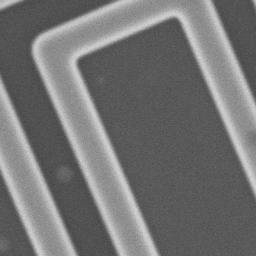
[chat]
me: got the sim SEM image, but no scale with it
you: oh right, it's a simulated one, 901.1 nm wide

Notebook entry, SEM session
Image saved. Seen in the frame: groups of lines, slits or small figures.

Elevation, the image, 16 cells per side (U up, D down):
DDDDDDUUUUUUUDDD
DDDDUUUUUUDUUUDD
DDUUUUUDDDDDUUDD
DDUUUDDDDDDDUUUD
DDDUUDDDDDDDDUUD
DDDUUDDDDDDDDUUD
UDDUUUDDDDDDDDUU
UDDDUUDDDDDDDDUU
UUDDUUUDDDDDDDUU
UUDDDUUDDDDDDDDU
UUDDDUUUDDDDDDDU
UUUDDDUUDDDDDDDD
DUUDDDUUDDDDDDDD
DUUUDDUUUDDDDDDD
DDUUDDDUUDDDDDDD
DDUUUDDUUUDDDDDD